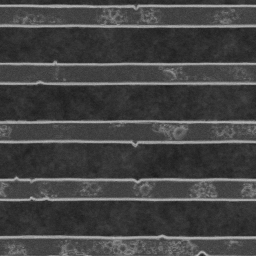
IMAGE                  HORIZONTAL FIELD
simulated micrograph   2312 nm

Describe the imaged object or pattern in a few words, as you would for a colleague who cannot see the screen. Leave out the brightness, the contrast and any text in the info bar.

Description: parallel lines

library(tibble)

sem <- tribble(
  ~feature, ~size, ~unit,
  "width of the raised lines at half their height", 19.8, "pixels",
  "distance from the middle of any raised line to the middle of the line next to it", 0.522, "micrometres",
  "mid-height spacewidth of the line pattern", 341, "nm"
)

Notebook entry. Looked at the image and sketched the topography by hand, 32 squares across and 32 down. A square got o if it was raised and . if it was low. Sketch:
................................
oooooooooooooooooooooooooooooooo
oooooooooooooooooooooooooooooooo
................................
................................
................................
................................
................................
oooooooooooooooooooooooooooooooo
oooooooooooooooooooooooooooooooo
................................
................................
................................
................................
................................
oooooooooooooooooooooooooooooooo
oooooooooooooooooooooooooooooooo
oooooooooooooooooooooooooooooooo
................................
................................
................................
................................
.oo.ooooooo.oo....ooooo..oooooo.
oooooooooooooooooooooooooooooooo
oooooooooooooooooooooooooooooooo
................................
................................
................................
................................
................................
oooooooooooooooooooooooooooooooo
oooooooooooooooooooooooooooooooo